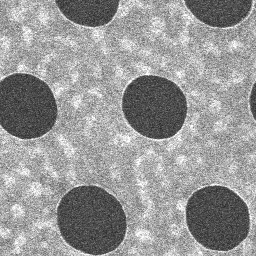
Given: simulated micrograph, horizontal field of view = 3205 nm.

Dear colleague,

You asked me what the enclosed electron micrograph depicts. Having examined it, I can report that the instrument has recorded holes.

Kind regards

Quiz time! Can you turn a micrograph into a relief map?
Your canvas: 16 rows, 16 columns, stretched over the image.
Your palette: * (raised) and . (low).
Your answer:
****...*****....
*****..******..*
****************
****************
****************
...*****...*****
....****....****
....****....****
*..******..*****
****************
****************
****************
****...*****...*
****....****....
****....****....
*****..******..*